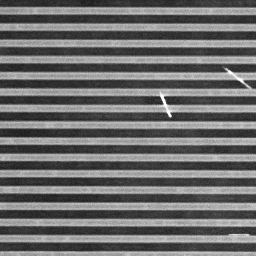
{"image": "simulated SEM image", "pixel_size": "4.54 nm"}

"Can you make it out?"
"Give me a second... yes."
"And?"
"parallel lines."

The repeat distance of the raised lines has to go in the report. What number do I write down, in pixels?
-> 16.3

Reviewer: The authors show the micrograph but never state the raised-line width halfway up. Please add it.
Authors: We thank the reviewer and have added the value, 0.0324 microns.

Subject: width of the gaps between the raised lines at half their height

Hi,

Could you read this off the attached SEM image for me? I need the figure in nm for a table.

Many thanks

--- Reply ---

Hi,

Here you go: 39.8